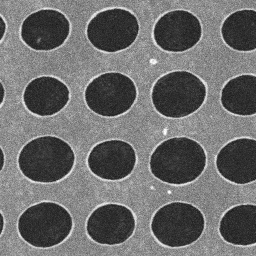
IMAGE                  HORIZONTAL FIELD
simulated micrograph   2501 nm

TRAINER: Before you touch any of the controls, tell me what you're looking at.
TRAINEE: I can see a regular array of holes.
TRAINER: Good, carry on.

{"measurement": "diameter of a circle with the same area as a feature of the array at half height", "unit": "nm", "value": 467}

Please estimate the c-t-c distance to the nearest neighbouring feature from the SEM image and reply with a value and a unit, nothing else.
625 nanometres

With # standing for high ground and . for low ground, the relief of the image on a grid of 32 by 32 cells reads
################################
#####..#####....#####...#####...
###.....###......###.....###....
.##......##......##......###....
###......##......##......###....
###.....####....####....####....
################################
################################
################################
############....####....######..
####....###......##......###....
.##......##......##.......##....
###......##......##.......##....
###.....###.....###......###....
#############.######...#########
################################
################################
####....#############...#####...
###......###.....###.....###....
##.......##......##.......#.....
##.......##......##.......#.....
###......###....###......##.....
####....#####..#####....####....
################################
################################
#####..######.#######...########
###.....####....####.....###....
##.......##......##.......##....
##.......##......##.......#.....
###.....###.....###......###....
####...######..#####....#####...
################################